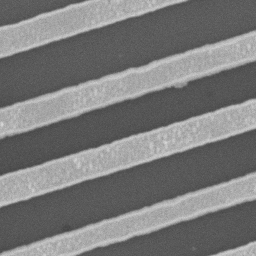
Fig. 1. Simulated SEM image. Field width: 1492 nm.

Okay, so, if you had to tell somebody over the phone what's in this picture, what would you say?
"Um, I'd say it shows lines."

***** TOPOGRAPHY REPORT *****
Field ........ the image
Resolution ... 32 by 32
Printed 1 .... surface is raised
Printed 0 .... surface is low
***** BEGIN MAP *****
00000000011111111111110000000000
00000011111111111100000000000000
00001111111111100000000000000000
11111111111100000000000000000000
11111111100000000000000000000011
11111100000000000000000000011111
11000000000000000000000011111111
00000000000000000000011111111111
00000000000000000011111111110000
00000000000000111111111110000000
00000000000111111111110000000000
00000001111111111100000000000000
00001111111111100000000000000001
01111111111100000000000000001111
11111111100000000000000001111111
11111100000000000000001111111111
11000000000000000011111111111100
00000000000000011111111111100000
00000000000011111111111100000000
00000000011111111111100000000000
00000111111111111000000000000000
00111111111111000000000000000000
11111111111000000000000000000111
11111111000000000000000000111111
11111000000000000000000111111111
10000000000000000000111111111000
00000000000000000111111111000000
00000000000000111111111000000000
00000000000111111111000000000000
00000001111111111000000000000000
00001111111110000000000000000001
01111111110000000000000000001111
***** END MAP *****